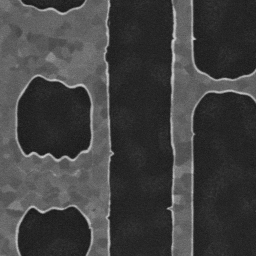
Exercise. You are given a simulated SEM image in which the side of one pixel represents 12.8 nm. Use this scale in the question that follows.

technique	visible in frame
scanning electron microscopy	one or a few lines or trenches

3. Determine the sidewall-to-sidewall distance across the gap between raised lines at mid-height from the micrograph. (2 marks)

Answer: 823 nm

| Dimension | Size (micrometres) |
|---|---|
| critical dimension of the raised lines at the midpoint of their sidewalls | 0.263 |